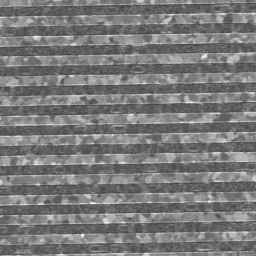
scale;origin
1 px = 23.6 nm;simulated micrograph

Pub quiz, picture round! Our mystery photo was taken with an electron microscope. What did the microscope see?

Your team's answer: parallel lines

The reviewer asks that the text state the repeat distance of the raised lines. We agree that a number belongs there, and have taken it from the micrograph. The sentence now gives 0.468 µm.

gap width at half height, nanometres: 248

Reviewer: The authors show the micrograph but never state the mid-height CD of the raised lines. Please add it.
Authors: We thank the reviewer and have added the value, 215 nm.